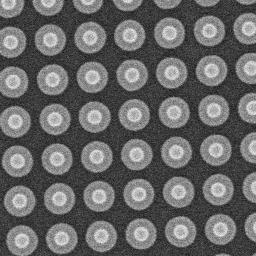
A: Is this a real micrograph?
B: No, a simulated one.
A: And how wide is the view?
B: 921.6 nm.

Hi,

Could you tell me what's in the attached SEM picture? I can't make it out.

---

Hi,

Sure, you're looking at an array of small figures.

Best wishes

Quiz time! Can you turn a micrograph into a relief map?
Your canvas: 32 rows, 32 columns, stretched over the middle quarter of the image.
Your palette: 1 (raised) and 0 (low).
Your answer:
00001111110000111111000111111100
00001111110001111111100111111110
10011111111001111111100111111110
10011111111001111111100111111110
10011111111000111111000011111100
10001111110000111111000001111000
00000111100000001100000000000000
00000000000000000000000000000000
00000000000000000000000000111000
00000000000000001111000001111100
00000111110000111111100011111110
10001111111000111111100011111110
10001111111000111111100011111110
11001111111100111111100011111110
10001111111000111111100011111110
10001111111000011111000000111000
10000011110000000110000000000000
00000000000000000000000000000000
00000000000000000000000000011100
00000001100000001111000001111110
00000111111000011111100001111111
10000111111100111111110011111111
11001111111100111111110011111111
11001111111100111111110001111111
11000111111100011111110001111110
11000111111000001111100000111100
10000011110000000000000000000000
00000000000000000000000000000000
00000000000000000000000000011100
00000001110000001111100000111111
10000011111100011111110001111111
11000111111100011111110001111111